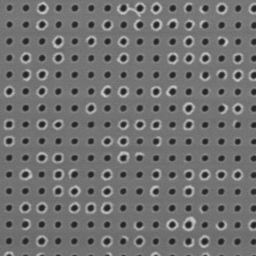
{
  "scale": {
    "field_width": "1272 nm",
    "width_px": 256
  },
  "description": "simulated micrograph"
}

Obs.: a regular array of holes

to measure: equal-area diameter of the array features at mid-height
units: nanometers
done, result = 32.7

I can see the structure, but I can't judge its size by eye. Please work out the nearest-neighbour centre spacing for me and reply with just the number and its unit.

80.4 nanometres